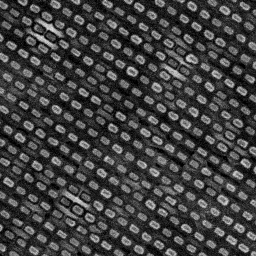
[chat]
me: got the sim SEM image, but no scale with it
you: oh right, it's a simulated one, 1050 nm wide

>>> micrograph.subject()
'a regular array of raised bodies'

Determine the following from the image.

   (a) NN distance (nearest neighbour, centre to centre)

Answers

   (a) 56.7 nm